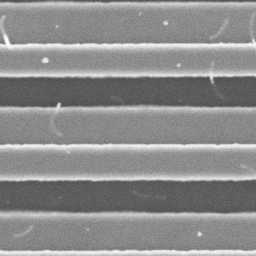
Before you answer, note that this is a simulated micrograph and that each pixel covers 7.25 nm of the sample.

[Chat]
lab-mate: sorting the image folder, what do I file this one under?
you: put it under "lines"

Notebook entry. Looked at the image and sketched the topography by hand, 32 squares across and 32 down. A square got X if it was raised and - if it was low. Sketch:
XX----XXXXXXXXXXXXXXXXXXXXXXXXXX
XXXXXXXXXXXXXXXXXXXXXXXXXXXXXXXX
XXXXXXXXXXXXXXXXXXXXXXXXXXXXXXXX
XXXXXXXXXXXXXXXXXXXXXXXXXXXXXXXX
XXXXXXXXXXXXXXXXXXXXXXXXXXXXXXXX
XXXXXXXXXXXXXXXXXXXXXXXXXXXXXXXX
XXXXXXXXXXXXXXXXXXXXXXXXXXXXXXXX
XXXXXXXXXXXXXXXXXXXXXXXXXXXXXXXX
XXXXXXXXXXXXXXXXXXXXXXXXXXXXXXXX
--------------------------X-----
--------------------------------
--------------------------------
--------------------------------
-------X------------------------
XXXXXXXXXXXXXXXXXXXXXXXXXXXXXXXX
XXXXXXXXXXXXXXXXXXXXXXXXXXXXXXXX
XXXXXXXXXXXXXXXXXXXXXXXXXXXXXXXX
XXXXXXXXXXXXXXXXXXXXXXXXXXXXXXXX
XXXXXXXXXXXXXXXXXXXXXXXXXXXXXXXX
XXXXXXXXXXXXXXXXXXXXXXXXXXXXXXXX
XXXXXXXXXXXXXXXXXXXXXXXXXXXXXXXX
XXXXXXXXXXXXXXXXXXXXXXXXXXXXXXXX
--------------------------------
--------------------------------
--------------------------------
--------------------------------
--------------------------------
XXXXXXXXXXXXXXXXXXXXXXXXXXXXXXXX
XXXXXXXXXXXXXXXXXXXXXXXXXXXXXXXX
XXXXXXXXXXXXXXXXXXXXXXXXXXXXXXXX
XXXXXXXXXXXXXXXXXXXXXXXXXXXXXXXX
XXXXXXXXXXXXXXXXXXXXXXXXXXXXXXXX